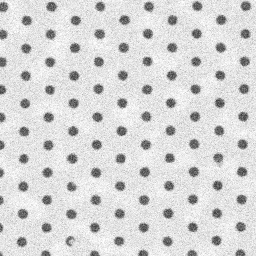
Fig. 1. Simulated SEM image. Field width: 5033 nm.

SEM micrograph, a regular array of holes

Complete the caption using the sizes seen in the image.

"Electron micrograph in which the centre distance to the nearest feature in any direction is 538 nanometres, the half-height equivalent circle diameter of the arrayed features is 207 nanometres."